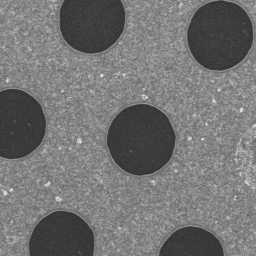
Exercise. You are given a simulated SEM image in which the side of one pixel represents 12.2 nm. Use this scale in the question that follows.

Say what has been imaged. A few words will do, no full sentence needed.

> holes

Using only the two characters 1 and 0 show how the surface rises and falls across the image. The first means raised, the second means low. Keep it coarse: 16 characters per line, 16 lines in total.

1111000011111001
1111000011110000
1111000111110000
1111111111110001
1111111111111111
1111111111111111
0011111111111111
0001111000011111
0001111000011111
0011111000011111
1111111100111111
1111111111111111
1111111111111111
1110011111111111
1100001111100111
1100001111000011